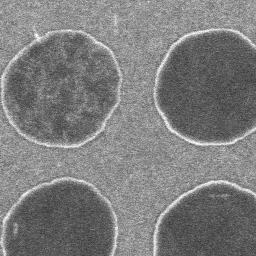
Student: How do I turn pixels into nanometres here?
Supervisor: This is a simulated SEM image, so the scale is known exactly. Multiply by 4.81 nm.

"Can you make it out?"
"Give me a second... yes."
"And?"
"raised bodies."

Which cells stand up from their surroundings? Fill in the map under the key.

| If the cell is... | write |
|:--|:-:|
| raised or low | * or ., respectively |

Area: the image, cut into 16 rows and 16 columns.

................
................
..****.....*****
.******...******
*******...******
*******...******
*******...******
.******...******
.*****.....****.
................
................
...***.......*..
.******....*****
*******...******
*******...******
*******...******